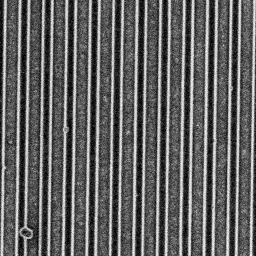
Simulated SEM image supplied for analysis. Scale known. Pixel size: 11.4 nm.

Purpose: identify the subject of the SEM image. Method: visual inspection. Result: parallel lines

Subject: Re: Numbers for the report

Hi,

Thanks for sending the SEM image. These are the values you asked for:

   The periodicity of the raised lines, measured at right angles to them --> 0.267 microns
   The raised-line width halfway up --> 112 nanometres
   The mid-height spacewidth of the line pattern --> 158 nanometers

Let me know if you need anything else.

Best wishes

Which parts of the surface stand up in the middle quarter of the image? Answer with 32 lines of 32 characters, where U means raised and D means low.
DUUDDDUUUDDDUUDDDDUUDDDDUUDDDDUU
DUUDDDUUUDDDUUDDDDUUDDDDUUDDDDUU
DUUDDDUUDDDDUUDDDDUUDDDDUUDDDDUU
DUUDDDUUDDDDUUDDDDUUDDDDUUDDDDUU
DUUDDDUUDDDDUUDDDDUUDDDDUUDDDDUU
DUUDDDUUDDDDUUDDDDUUDDDDUUDDDDUU
UUUDDDUUDDDDUUDDDDUUDDDDUUDDDDUU
UUUDDDUUDDDDUUDDDDUUDDDDUUDDDDUU
UUUDDDUUDDDDUUDDDDUUDDDDUUDDDDUU
UUUDDDUUDDDDUUDDDDUUDDDDUUDDDDUU
UUUDDDUUDDDDUUDDDDUUDDDDUUDDDDUU
UUUDDDUUDDDDUUDDDDUUDDDDUUDDDDUU
UUUDDDUUDDDDUUDDDDUUDDDDUUDDDDUU
UUUDDDUUDDDDUUDDDDUUDDDDUUDDDDUU
UUUDDDUUDDDDUUDDDDUUDDDDUUDDDDUU
UUUDDDUUDDDDUUDDDDUUDDDDUUDDDDUU
UUUDDDUUDDDDUUDDDDUUDDDDUUDDDDUU
UUUDDDUUDDDDUUDDDDUUDDDDUUDDDDUU
UUUDDDUUDDDDUUDDDDUUDDDDUUDDDDUU
UUUDDDUUDDDDUUDDDDUUDDDDUUDDDDUU
UUUDDDUUDDDDUUDDDDUUDDDDUUDDDDUU
UUUDDDUUDDDDUUDDDDUUDDDDUUDDDDUU
UUUDDDUUDDDDUUDDDDUUDDDDUUDDDDUU
UUDDDDUUDDDDUUDDDDUUDDDDUUDDDDUU
UUDDDDUUDDDDUUDDDDUUDDDDUUDDDDUU
UUDDDDUUDDDDUUDDDDUUDDDDUUDDDUUU
UUDDDDUUDDDDUUDDDDUUDDDDUUDDDUUU
UUDDDDUUDDDDUUDDDDUUDDDDUUDDDUUU
UUDDDDUUDDDDUUDDDDUUDDDDUUDDDUUU
UUDDDDUUDDDDUUDDDDUUDDDUUUDDDUUU
UUDDDDUUDDDDUUDDDDUUDDDUUUDDDUUU
UUDDDDUUDDDDUUDDDDUUDDDUUUDDDUUU